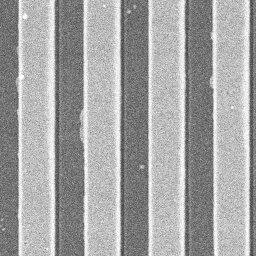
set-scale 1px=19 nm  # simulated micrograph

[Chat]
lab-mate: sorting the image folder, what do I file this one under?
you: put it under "lines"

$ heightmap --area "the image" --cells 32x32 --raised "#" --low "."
..#####....####....####....####.
..#####....####....####....####.
..#####....####....####....####.
..#####....####....####....####.
..#####....####....####....####.
..#####....####....####....####.
..#####....####....####....####.
..#####....####....####....####.
..#####....####....####....####.
..#####....####....####....####.
..#####....####....####....####.
..#####....####....####....####.
..#####....####....####....####.
..#####....####....####....####.
..#####....####....####....####.
..#####....####....####....####.
..#####....####....####....####.
..#####....####....####....####.
..#####....####....####....####.
..#####....####....####....####.
..#####....####....####....####.
..#####....####....####....####.
..#####....####....####....####.
..#####....####....####....####.
..#####....####....####....####.
..#####....####....####....####.
..#####....####....####....####.
..#####....####....####....####.
..#####....####....####....####.
..#####....####....####....####.
..#####....####....####....####.
..#####....####....####....####.